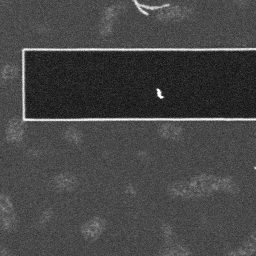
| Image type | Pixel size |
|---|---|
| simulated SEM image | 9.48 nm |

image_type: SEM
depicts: one or a few lines or trenches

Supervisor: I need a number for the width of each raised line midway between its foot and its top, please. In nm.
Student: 662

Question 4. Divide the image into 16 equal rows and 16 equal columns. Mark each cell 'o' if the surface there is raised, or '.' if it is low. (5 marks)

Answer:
................
................
................
..oooooooooooooo
.ooooooooooooooo
.ooooooooooooooo
.ooooooooooooooo
................
................
................
................
................
................
................
................
................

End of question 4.